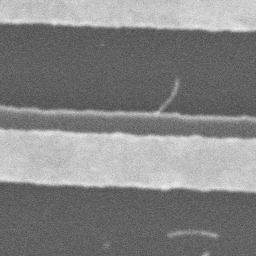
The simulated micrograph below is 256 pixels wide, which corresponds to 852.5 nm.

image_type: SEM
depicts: lines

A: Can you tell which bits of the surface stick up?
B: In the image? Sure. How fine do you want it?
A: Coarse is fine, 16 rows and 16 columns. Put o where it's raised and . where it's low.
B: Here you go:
oooooooooooooooo
....oooooooooooo
................
................
................
................
................
oooooooooooooooo
oooooooooooooooo
oooooooooooooooo
oooooooooooooooo
...ooooooooooooo
................
................
................
................